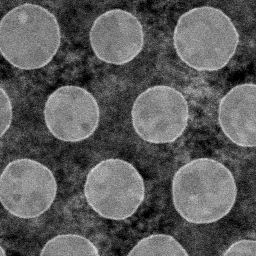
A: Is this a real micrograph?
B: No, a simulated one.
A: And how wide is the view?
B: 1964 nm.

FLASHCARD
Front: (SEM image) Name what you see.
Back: raised bodies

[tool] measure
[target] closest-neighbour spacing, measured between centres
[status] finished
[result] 673 nanometres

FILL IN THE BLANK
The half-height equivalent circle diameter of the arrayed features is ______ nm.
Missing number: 442